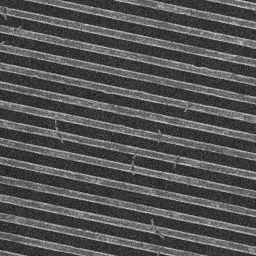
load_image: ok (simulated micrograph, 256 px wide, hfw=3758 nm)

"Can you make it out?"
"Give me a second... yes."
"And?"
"parallel lines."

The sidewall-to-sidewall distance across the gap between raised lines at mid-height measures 172 nm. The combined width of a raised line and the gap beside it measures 270 nm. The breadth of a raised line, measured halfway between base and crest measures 98.8 nm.